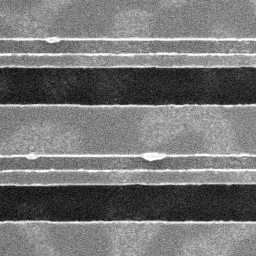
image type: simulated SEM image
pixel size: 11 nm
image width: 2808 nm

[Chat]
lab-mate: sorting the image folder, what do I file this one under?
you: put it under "lines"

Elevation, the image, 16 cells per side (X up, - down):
XXXXXXXXXXXXXXXX
XXXXXXXXXXXXXXXX
XXXXXXXXXXXXXXXX
XXXXXXXXXXXXXXXX
----------------
----------------
----------------
XXXXXXXXXXXXXXXX
XXXXXXXXXXXXXXXX
XXXXXXXXXXXXXXXX
XXXXXXXXXXXXXXXX
XXXXXXXX-XXX----
----------------
----------------
XXXXXXXXXXXXXXXX
XXXXXXXXXXXXXXXX